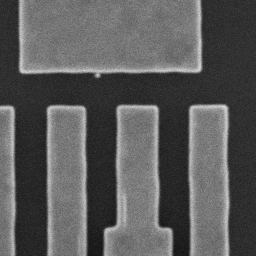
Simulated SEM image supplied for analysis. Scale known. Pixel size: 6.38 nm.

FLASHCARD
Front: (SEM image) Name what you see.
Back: wiring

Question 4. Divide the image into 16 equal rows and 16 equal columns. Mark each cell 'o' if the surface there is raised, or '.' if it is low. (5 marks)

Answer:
.oooooooooooo...
.oooooooooooo...
.oooooooooooo...
.oooooooooooo...
..o.............
................
................
o..oo..ooo..oo..
o..oo..ooo..oo..
o..oo..ooo..oo..
o..oo..ooo..oo..
o..oo..ooo..oo..
o..oo..ooo..oo..
o..oo..ooo..oo..
o..oo..oooo.oo..
o..oo..oooo.oo..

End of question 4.